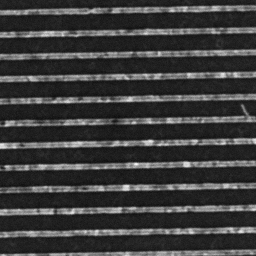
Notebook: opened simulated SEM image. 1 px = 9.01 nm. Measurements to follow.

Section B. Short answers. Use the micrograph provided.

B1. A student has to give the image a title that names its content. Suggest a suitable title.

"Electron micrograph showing parallel lines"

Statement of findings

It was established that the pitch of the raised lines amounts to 0.2 microns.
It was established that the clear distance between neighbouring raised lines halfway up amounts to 167 nm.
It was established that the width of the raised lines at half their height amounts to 33.8 nm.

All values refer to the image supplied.